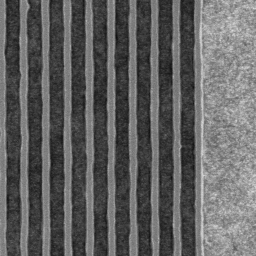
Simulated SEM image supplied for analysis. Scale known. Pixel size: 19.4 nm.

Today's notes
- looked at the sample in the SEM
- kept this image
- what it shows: parallel lines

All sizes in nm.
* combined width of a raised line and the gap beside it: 423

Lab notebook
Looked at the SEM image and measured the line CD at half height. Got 148 nm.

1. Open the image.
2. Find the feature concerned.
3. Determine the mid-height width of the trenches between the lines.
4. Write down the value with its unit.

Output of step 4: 0.279 microns